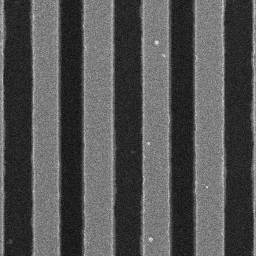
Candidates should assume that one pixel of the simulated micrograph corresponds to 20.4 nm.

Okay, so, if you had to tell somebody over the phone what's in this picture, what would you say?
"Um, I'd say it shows lines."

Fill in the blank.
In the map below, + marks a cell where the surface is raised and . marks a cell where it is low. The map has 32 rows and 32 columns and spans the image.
....+++....+++....+++...++++....
....+++...++++....+++...++++....
....+++...++++....+++...++++....
....+++...++++....+++...++++....
....+++....+++....+++...++++....
....+++....+++....+++...++++....
....+++....+++....+++...++++....
....+++....+++....+++...++++....
....+++....+++....+++...++++....
....+++....+++....+++...++++....
....+++....+++....+++...++++....
....+++....+++....+++...++++....
....+++....+++....+++...++++....
....+++....+++....+++...++++....
....+++....+++....+++...++++....
....+++....+++....+++...++++....
....+++....+++....+++...++++....
....+++....+++....+++...++++....
....+++....+++....+++...++++....
....+++....+++....+++...++++....
....+++....+++....+++...++++....
....+++....+++....+++...++++....
....+++....+++....+++...++++....
....+++....+++....+++...++++....
....+++....+++....+++...++++....
....+++....+++....+++....+++....
....+++....+++....+++...++++....
....+++....+++....+++...++++....
....+++....+++....+++....+++....
....+++....+++....+++....+++....
....+++....+++....+++...++++....
....+++....+++....+++....+++....